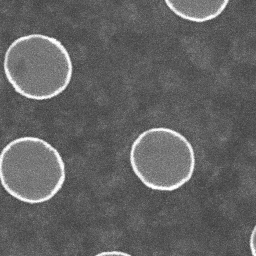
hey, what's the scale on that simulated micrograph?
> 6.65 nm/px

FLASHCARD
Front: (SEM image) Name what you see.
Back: raised bodies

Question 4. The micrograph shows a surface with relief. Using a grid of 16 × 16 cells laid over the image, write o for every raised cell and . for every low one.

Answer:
...........ooo..
................
.oo.............
oooo............
oooo............
.ooo............
................
................
.........oo.....
oooo....oooo....
oooo....oooo....
oooo.....oo.....
.oo.............
................
................
................